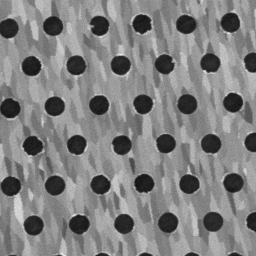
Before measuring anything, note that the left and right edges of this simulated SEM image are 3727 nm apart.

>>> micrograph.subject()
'a regular array of holes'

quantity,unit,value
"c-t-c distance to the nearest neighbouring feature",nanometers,642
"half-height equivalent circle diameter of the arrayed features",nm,292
